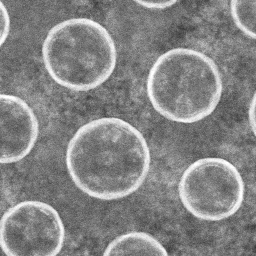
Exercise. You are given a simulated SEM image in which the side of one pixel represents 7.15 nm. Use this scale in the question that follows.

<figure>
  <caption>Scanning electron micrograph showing raised bodies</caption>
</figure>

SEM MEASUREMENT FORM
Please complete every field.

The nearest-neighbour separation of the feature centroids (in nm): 761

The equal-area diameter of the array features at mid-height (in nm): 484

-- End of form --